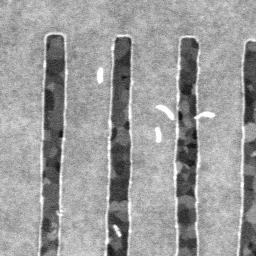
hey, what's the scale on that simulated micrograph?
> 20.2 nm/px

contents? one or a few lines or trenches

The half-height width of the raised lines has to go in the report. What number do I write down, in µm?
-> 0.416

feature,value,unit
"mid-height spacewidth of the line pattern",944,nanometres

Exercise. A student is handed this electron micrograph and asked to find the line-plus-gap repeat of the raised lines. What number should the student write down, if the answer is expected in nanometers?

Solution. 1360